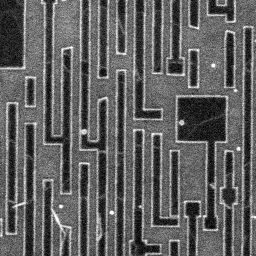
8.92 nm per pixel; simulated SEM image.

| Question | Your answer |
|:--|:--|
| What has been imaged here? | wiring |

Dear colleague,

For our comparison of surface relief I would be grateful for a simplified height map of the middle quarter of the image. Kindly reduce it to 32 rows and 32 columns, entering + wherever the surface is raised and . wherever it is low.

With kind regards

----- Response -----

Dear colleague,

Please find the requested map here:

++..++...++.......++..++..++++.+
++..++...++.......++..++..++++.+
++..++...++..++...++......++++.+
++..++.......++...++...........+
++..++.......++...++...........+
++..++.......++...++...........+
++..++.......++...++............
++..++.......++...++............
++..++.......++...++........++++
++..++...++..++...++........++++
++..++...++..++...++........++++
++..++...++..++...++++++....++++
++..++...++..++...++++++....++++
++..++...++..++...++++++....++++
++..++...++..++.............++++
++..++...++..++.............++++
++..++...++..++...++........++++
++..++...++..++...++..++....++++
++..++...++..++...++..++....++++
++..+++++++..++...++..++......++
++..+++++++..++...++..++........
++......+++..++...++..++........
++......+++..++...++..++...++...
++......+++..++...++..++...++...
++......+++..++...++..++...++...
++..++..+++..++...++..++...++...
++..++..+++..++...++..++...++...
++..++..+++..++...++..++...++...
++..++..+++..++...++..++...++...
++..++..+++..++...++..++...++...
++..++..+++..++...++..++...++...
++..++..+++..++...++..++...++...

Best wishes